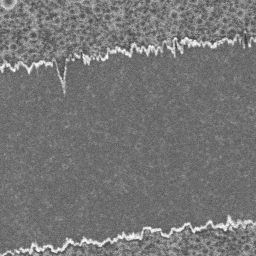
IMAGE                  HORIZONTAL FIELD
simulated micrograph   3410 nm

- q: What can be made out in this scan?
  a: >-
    one or a few lines or trenches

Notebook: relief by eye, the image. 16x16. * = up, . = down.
****************
****************
****************
*******.........
................
................
................
................
................
................
................
................
................
................
.........*.*****
..*.************